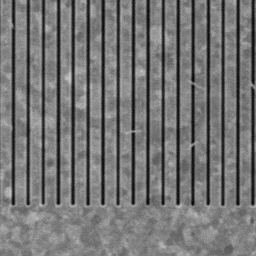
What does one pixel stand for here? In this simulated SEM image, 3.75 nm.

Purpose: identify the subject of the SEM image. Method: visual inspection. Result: parallel lines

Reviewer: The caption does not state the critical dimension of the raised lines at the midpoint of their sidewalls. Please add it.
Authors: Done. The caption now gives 0.0418 µm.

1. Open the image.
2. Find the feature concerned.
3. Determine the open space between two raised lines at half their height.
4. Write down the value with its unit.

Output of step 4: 16 nm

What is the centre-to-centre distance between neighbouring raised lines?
56.1 nm